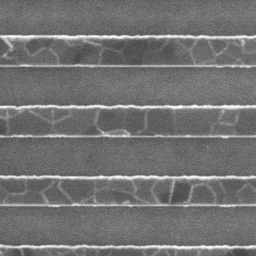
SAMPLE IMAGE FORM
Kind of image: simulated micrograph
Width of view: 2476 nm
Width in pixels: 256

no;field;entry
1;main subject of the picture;lines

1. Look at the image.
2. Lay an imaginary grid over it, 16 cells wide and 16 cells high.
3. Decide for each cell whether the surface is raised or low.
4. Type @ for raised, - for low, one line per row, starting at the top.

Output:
----------------
----------------
@@@@@@@@@@@@@@@@
@@@@@@@@@@@@@@@@
----------------
----------------
----------------
@@@@@@@@@@@@@@@@
@@@@@@@@@@@@@@@@
----------------
----------------
@@@@@@@@@@@@@@@@
@@@@@@@@@@@@@@@@
----------------
----------------
@@@@@@@@@@@@@@@@